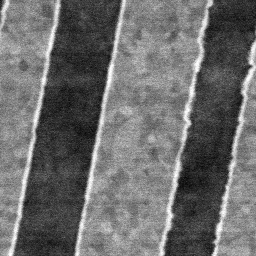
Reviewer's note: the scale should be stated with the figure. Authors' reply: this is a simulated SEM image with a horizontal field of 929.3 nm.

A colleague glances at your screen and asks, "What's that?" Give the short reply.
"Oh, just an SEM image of one or a few lines or trenches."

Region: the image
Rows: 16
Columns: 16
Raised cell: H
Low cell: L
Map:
HHHHLLLLHHHHHLLL
HHHLLLLHHHHHHLLL
HHHLLLLHHHHHHLLL
HHHLLLLHHHHHHLLL
HHHLLLLHHHHHLLLL
HHHLLLLHHHHHLLLH
HHLLLLHHHHHHLLLH
HHLLLLHHHHHHLLLH
HHLLLLHHHHHHLLLH
HHLLLLHHHHHLLLLH
HHLLLLHHHHHLLLHH
HHLLLLHHHHHLLLHH
HLLLLHHHHHHLLLHH
HLLLLHHHHHHLLLHH
HLLLLHHHHHLLLLHH
HLLLLHHHHHLLLHHH